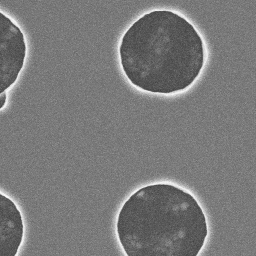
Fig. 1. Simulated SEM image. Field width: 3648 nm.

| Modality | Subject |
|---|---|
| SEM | holes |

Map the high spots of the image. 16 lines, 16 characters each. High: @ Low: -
@@@@@@@@@@@@@@@@
-@@@@@@@----@@@@
--@@@@@@-----@@@
--@@@@@@-----@@@
-@@@@@@@-----@@@
-@@@@@@@@---@@@@
@@@@@@@@@@@@@@@@
@@@@@@@@@@@@@@@@
@@@@@@@@@@@@@@@@
@@@@@@@@@@@@@@@@
@@@@@@@@@@@@@@@@
@@@@@@@@@@@@@@@@
-@@@@@@@----@@@@
-@@@@@@------@@@
-@@@@@@------@@@
-@@@@@@@-----@@@